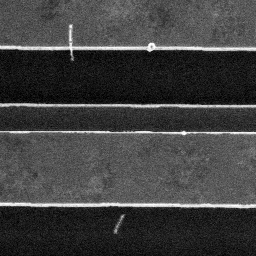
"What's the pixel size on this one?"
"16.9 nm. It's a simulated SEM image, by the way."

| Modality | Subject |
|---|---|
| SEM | lines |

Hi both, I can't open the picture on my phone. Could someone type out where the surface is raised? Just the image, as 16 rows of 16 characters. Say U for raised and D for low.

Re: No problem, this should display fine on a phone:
UUUUUUUUUUUUUUUU
UUUUUUUUUUUUUUUU
UUUUUUUUUUUUUUUU
DDDDDDDDDDDDDDDD
DDDDDDDDDDDDDDDD
DDDDDDDDDDDDDDDD
DDDDDDDDDDDDDDDD
DDDDDDDDDDDDDDDD
UUUUUUUUUUUUUUUU
UUUUUUUUUUUUUUUU
UUUUUUUUUUUUUUUU
UUUUUUUUUUUUUUUU
UUUUUUUUUUUUUUUU
DDDDDDDDDDDDDDDD
DDDDDDDDDDDDDDDD
DDDDDDDDDDDDDDDD